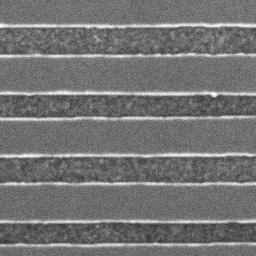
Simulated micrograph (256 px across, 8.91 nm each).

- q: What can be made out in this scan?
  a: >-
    lines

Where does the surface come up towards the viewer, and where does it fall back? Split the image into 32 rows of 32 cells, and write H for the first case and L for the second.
HHHHHHHHHHHHHHHHHHHHHHHHHHHHHHHH
HHHHHHHHHHHHHHHHHHHHHHHHHHHHHHHH
HHHHHHHHHHHHHHHHHHHHHHHHHHHHHHHH
LLLLLLLLLLLLLLLLLLLLLLLLLLLLLLLL
LLLLLLLLLLLLLLLLLLLLLLLLLLLLLLLL
LLLLLLLLLLLLLLLLLLLLLLLLLLLLLLLL
LLLLLLLLLLLLLLLLLLLLLLLLLLLLLLLL
HHHHHHHHHHHHHHHHHHHHHHHHHHHHHHHH
HHHHHHHHHHHHHHHHHHHHHHHHHHHHHHHH
HHHHHHHHHHHHHHHHHHHHHHHHHHHHHHHH
HHHHHHHHHHHHHHHHHHHHHHHHHHHHHHHH
HHHHHHHHHHHHHHHHHHHHHHHHHHHHHHHH
LLLLLLLLLLLLLLLLLLLLLLLLLLLLLLLL
LLLLLLLLLLLLLLLLLLLLLLLLLLLLLLLL
LLLLLLLLLLLLLLLLLLLLLLLLLLLLLLLL
HHHHHHHHHHHHHHHHHHHHHHHHHHHHHHHH
HHHHHHHHHHHHHHHHHHHHHHHHHHHHHHHH
HHHHHHHHHHHHHHHHHHHHHHHHHHHHHHHH
HHHHHHHHHHHHHHHHHHHHHHHHHHHHHHHH
HHHHHLHHLLLLLLLLLLHLLLLLLLLLLLLL
LLLLLLLLLLLLLLLLLLLLLLLLLLLLLLLL
LLLLLLLLLLLLLLLLLLLLLLLLLLLLLLLL
LLLLLLLLLLLLLLLLLLLLLLLLLLLLLLLL
HHHHHHHHHHHHHHHHHHHHHHHHHHHHHHHH
HHHHHHHHHHHHHHHHHHHHHHHHHHHHHHHH
HHHHHHHHHHHHHHHHHHHHHHHHHHHHHHHH
HHHHHHHHHHHHHHHHHHHHHHHHHHHHHHHH
HHHHHHHHHHHHHHHHHHHHHHHHHHHHHHHH
LLLLLLLLLLLLLLLLLLLLLLLLLLLLLLLL
LLLLLLLLLLLLLLLLLLLLLLLLLLLLLLLL
LLLLLLLLLLLLLLLLLLLHLLLLLLHHHHHH
HHHHHHHHHHHHHHHHHHHHHHHHHHHHHHHH